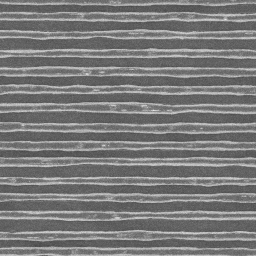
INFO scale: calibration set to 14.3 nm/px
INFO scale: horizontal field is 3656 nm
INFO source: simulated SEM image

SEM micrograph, parallel lines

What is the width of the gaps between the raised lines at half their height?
150 nm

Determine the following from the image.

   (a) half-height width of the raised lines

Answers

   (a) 0.109 µm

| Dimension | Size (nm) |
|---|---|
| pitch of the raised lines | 260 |